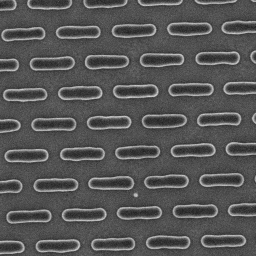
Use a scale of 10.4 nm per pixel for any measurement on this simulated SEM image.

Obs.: groups of lines, slits or small figures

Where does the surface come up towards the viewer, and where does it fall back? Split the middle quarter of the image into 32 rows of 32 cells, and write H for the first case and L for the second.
HHLLLLHHHHHHHHHLLLLLLLHHHLLLLLLL
LLLLLLLLLLLLLLLLLLLLLLLLLLLLLLLL
LLLLLLLLLLLLLLLLLLLLLLLLLLLLLLLL
LLLLLLLLLLLLLLLLLLLLLLLLLLLLLLLL
LLLLLLLLLLLLLLLLLLLLLLLLLLLLLLLL
LLLLLLLLLLLLLHHHHHHHHHHLLLLHHHHH
HHHHHHHHHLLLHHHHHHHHHHHLLLHHHHHH
HHHHHHHHHLLLLHHHHHHHHHHLLLHHHHHH
HHHHHHHHHLLLLLLLLLLLLLLLLLLLLLLL
LLLLLLLLLLLLLLLLLLLLLLLLLLLLLLLL
LLLLLLLLLLLLLLLLLLLLLLLLLLLLLLLL
LLLLLLLLLLLLLLLLLLLLLLLLLLLLLLLL
LLLLLLLLLLLLLLLLLLLLLLLLLLLLLLLL
LLLLLLLHHHHHHHHHLLLLHHHHHHHHHHLL
HHHLLLHHHHHHHHHHHLLLHHHHHHHHHHLL
HHHLLLHHHHHHHHHHLLLLHHHHHHHHHLLL
LLLLLLLLLLLLLLLLLLLLLLLLLLLLLLLL
LLLLLLLLLLLLLLLLLLLLLLLLLLLLLLLL
LLLLLLLLLLLLLLLLLLLLLLLLLLLLLLLL
LLLLLLLLLLLLLLLLLLLLLLLLLLLLLLLL
LLLLLLLLLLLLLLLLLLHHHLLLLLLLHHHH
HHHHHHHHHHLLLHHHHHHHHHHHLLLHHHHH
HHHHHHHHHHLLLHHHHHHHHHHHLLLHHHHH
HHHHHHHHHHLLLLHHHHHHLLLLLLLLLLLL
LLLLLLLLLLLLLLLLLLLLLLLLLLLLLLLL
LLLLLLLLLLLLLLLLLLLLLLLLLLLLLLLL
LLLLLLLLLLLLLLLLLLLLLLLLLLLLLLLL
LLLLLLLLLLLLLLLLLLLLLLLLLLLLLLLL
LLLLLLLLLLLLHHHHHLLLLHHHHHHHHHHL
HHHLLLHHHHHHHHHHHLLLHHHHHHHHHHHL
HHHLLLHHHHHHHHHHHLLLHHHHHHHHHHLL
HLLLLLLLLLLLLLLLLLLLLLLLLLLLLLLL